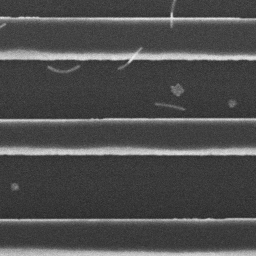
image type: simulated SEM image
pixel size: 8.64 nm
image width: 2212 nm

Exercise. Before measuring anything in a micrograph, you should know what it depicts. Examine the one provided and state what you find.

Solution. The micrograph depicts lines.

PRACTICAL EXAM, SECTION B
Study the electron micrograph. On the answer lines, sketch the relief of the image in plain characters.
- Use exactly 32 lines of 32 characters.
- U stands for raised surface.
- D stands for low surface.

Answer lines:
DDDDDDDDDDDDDDDDDDDDDDDDDDDDDDDD
DDDDDDDDDDDDDDDDDDDDDDDDDDDDDDDD
UUUUUUUUUUUUUUUUUUUUUUUUUUUUUUUU
UUUUUUUUUUUUUUUUUUUUUUUUUUUUUUUU
UUUUUUUUUUUUUUUUUUUUUUUUUUUUUUUU
UUUUUUUUUUUUUUUUUUUUUUUUUUUUUUUU
UUUUUUUUUUUUUUUUUUUUUUUUUUUUUUUU
DDDDDDDDDDDDDDDDDDDDDDDDDDDDDDDD
DDDDDDDDDDDDDDDDDDDDDDDDDDDDDDDD
DDDDDDDDDDDDDDDDDDDDDDDDDDDDDDDD
DDDDDDDDDDDDDDDDDDDDDDDDDDDDDDDD
DDDDDDDDDDDDDDDDDDDDDDDDDDDDDDDD
DDDDDDDDDDDDDDDDDDDDDDDDDDDDDDDD
DDDDDDDDDDDDDDDDDDDDDDDDDDDDDDDD
DDDDDDDDDDDDDDDDDDDDDDDDDDDDDDDD
UUUUUUUUUUUUUUUUUUUUUUUUUUUUUUUU
UUUUUUUUUUUUUUUUUUUUUUUUUUUUUUUU
UUUUUUUUUUUUUUUUUUUUUUUUUUUUUUUU
UUUUUUUUUUUUUUUUUUUUUUUUUUUUUUUU
DDDDDDDDDDDDDDDDDDDDDDDDDDDDDDDD
DDDDDDDDDDDDDDDDDDDDDDDDDDDDDDDD
DDDDDDDDDDDDDDDDDDDDDDDDDDDDDDDD
DDDDDDDDDDDDDDDDDDDDDDDDDDDDDDDD
DDDDDDDDDDDDDDDDDDDDDDDDDDDDDDDD
DDDDDDDDDDDDDDDDDDDDDDDDDDDDDDDD
DDDDDDDDDDDDDDDDDDDDDDDDDDDDDDDD
DDDDDDDDDDDDDDDDDDDDDDDDDDDDDDDD
UUUUUUUUUUUUUUUUUUUUUUUUUUUUUUUU
UUUUUUUUUUUUUUUUUUUUUUUUUUUUUUUU
UUUUUUUUUUUUUUUUUUUUUUUUUUUUUUUU
UUUUUUUUUUUUUUUUUUUUUUUUUUUUUUUU
UUUUUUUUUUUUUUUUUUUUUUUUUUUUUUUU